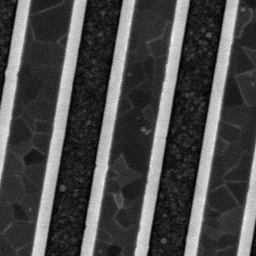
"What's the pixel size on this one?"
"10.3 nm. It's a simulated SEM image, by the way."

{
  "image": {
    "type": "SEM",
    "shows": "one or a few lines or trenches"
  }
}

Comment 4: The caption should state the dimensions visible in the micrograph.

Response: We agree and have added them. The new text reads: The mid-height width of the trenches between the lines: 497 nm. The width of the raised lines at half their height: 552 nm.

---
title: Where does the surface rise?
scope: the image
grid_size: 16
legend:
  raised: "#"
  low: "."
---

.####...###...##
.####...###...##
.####...###...##
.###....###...##
.###...####...##
.###...####...##
####...###...###
####...###...###
####...###...###
###...####...###
###...####...###
###...####...###
###...###...####
###...###...####
###...###...###.
##...####...###.